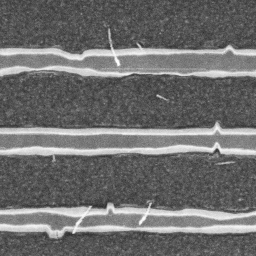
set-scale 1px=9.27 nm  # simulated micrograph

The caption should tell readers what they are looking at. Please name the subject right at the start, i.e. one or a few lines or trenches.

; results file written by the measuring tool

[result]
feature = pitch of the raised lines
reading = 735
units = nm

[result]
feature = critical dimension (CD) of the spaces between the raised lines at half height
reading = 0.546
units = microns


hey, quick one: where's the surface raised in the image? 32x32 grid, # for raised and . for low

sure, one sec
................................
................................
................................
................................
................................
................................
########........##########.###.#
################################
#######.########################
................................
................................
................................
................................
................................
................................
................................
########...######.....##########
################################
################################
................................
................................
................................
................................
................................
................................
................................
###################.............
################################
################################
................................
................................
................................